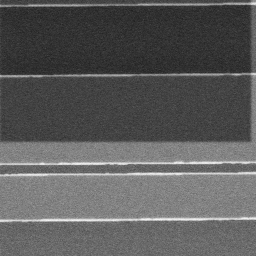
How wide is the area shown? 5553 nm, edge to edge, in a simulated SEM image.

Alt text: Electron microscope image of lines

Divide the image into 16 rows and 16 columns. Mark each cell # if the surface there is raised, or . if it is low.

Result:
................
................
................
................
................
################
################
################
################
################
################
################
################
################
................
................